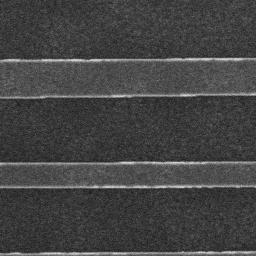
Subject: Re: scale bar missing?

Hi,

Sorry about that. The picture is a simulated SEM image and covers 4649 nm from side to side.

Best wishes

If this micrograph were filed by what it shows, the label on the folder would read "lines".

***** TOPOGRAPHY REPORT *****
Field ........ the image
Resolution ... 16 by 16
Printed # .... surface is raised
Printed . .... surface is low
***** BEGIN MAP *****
................
................
................
................
################
################
................
................
................
................
################
################
................
................
................
................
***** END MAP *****